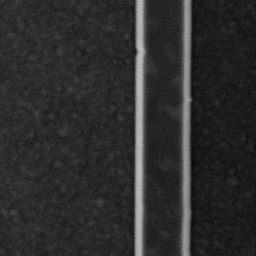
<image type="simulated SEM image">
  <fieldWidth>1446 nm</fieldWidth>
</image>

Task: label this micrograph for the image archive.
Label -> one or a few lines or trenches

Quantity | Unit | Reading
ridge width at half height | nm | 285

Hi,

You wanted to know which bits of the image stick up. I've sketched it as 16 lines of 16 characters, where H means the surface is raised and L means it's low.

LLLLLLLLLHHHLLLL
LLLLLLLLLHHHLLLL
LLLLLLLLLHHHLLLL
LLLLLLLLLHHHLLLL
LLLLLLLLLHHHLLLL
LLLLLLLLLHHHLLLL
LLLLLLLLLHHHLLLL
LLLLLLLLLHHHLLLL
LLLLLLLLLHHHLLLL
LLLLLLLLLHHHLLLL
LLLLLLLLLHHHLLLL
LLLLLLLLLHHHLLLL
LLLLLLLLLHHHLLLL
LLLLLLLLLHHHLLLL
LLLLLLLLLHHHLLLL
LLLLLLLLLHHHLLLL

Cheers